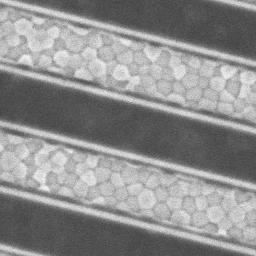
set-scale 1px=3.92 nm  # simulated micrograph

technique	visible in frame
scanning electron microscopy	one or a few lines or trenches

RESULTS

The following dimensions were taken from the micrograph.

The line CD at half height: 217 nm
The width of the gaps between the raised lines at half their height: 247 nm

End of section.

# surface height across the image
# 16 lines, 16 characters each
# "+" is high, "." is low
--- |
..++++++++++++++
......++++++++++
..........++++++
..............++
++..............
++++++..........
++++++++++......
++++++++++++++..
...+++++++++++++
.......+++++++++
...........+++++
...............+
+++.............
+++++++.........
+++++++++++.....
+++++++++++++++.